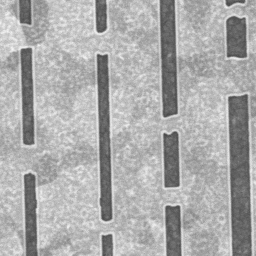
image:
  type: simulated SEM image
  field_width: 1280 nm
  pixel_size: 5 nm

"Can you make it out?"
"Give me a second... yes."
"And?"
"one or a few lines or trenches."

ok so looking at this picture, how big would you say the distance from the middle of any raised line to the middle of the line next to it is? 342 nanometers